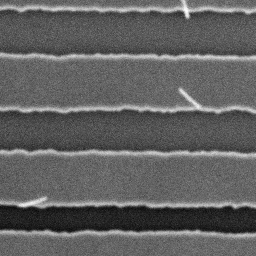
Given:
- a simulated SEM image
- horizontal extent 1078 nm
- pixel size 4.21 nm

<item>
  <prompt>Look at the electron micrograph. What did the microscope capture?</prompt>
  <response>lines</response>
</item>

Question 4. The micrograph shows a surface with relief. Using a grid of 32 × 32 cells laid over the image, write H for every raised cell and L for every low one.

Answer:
HHHHHHHHHHHHHHHHHHHHHHHHHHHHHHHH
LLLLLLLLLLLLLLLLLLLLLLLHLLLLLLLH
LLLLLLLLLLLLLLLLLLLLLLLLLLLLLLLL
LLLLLLLLLLLLLLLLLLLLLLLLLLLLLLLL
LLLLLLLLLLLLLLLLLLLLLLLLLLLLLLLL
LLLLLLLLLLLLLLLLLLLLLLLLLLLLLLLL
LLLLLLLLLLLLLLLLLLLLLLLLLLLLLLLL
HHHHHHHHHHHHHHHHHHHHHHHHHHHHHHHH
HHHHHHHHHHHHHHHHHHHHHHHHHHHHHHHH
HHHHHHHHHHHHHHHHHHHHHHHHHHHHHHHH
HHHHHHHHHHHHHHHHHHHHHHHHHHHHHHHH
HHHHHHHHHHHHHHHHHHHHHHHHHHHHHHHH
HHHHHHHHHHHHHHHHHHHHHHHHHHHHHHHH
HHHHHHHHHHHHHHHHHHHHHHHHHHHHHHHH
LLLLLLLLLLLLLLLLLLLLLLLLLLLLLLLL
LLLLLLLLLLLLLLLLLLLLLLLLLLLLLLLL
LLLLLLLLLLLLLLLLLLLLLLLLLLLLLLLL
LLLLLLLLLLLLLLLLLLLLLLLLLLLLLLLL
LLLLLLLLLLLLLLLLLLLLLLLLLLLLLLLL
HHHHHHHHHHHHHHHHHHHHHHHHHHHHHHHH
HHHHHHHHHHHHHHHHHHHHHHHHHHHHHHHH
HHHHHHHHHHHHHHHHHHHHHHHHHHHHHHHH
HHHHHHHHHHHHHHHHHHHHHHHHHHHHHHHH
HHHHHHHHHHHHHHHHHHHHHHHHHHHHHHHH
HHHHHHHHHHHHHHHHHHHHHHHHHHHHHHHH
HHHHHHHHHHHHHHHHHHHHHHHHHHHHHHHH
LLLLLLLLLLLLLLLLLLLLLLLLLLLLLLLL
LLLLLLLLLLLLLLLLLLLLLLLLLLLLLLLL
LLLLLLLLLLLLLLLLLLLLLLLLLLLLLLLL
HHHHHHHHHHHHHHHHHHHHHHHHHHHHHHHH
HHHHHHHHHHHHHHHHHHHHHHHHHHHHHHHH
HHHHHHHHHHHHHHHHHHHHHHHHHHHHHHHH